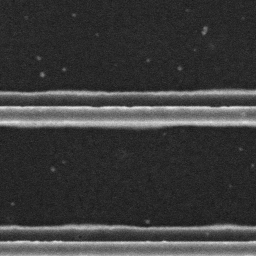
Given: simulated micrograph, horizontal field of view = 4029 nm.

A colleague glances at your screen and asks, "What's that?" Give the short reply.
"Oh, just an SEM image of lines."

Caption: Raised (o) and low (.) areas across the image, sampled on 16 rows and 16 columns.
................
................
................
................
................
................
oooooooooooooooo
oooooooooooooooo
................
................
................
................
................
................
oooooooooooooooo
oooooooooooooooo